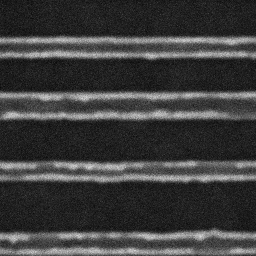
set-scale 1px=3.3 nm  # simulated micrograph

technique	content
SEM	one or a few lines or trenches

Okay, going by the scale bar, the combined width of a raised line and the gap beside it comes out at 65.5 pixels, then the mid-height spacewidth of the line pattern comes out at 0.142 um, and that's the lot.